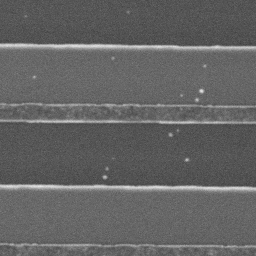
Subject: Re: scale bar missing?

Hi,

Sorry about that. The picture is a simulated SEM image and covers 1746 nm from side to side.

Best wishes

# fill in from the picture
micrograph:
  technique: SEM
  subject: lines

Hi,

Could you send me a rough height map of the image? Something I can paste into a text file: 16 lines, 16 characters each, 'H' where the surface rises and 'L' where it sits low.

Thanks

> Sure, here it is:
LLLLLLLLLLLLLLLL
LLLLLLLLLLLLLLLL
LLLLLLLLLLLLLLLL
HHHHHHHHHHHHHHHH
HHHHHHHHHHHHHHHH
HHHHHHHHHHHHHHHH
HHHHHHHHHHHHHHHH
HHHHHHHHHHHHHHHH
LLLLLLLLLLLLLLLL
LLLLLLLLLLLLLLLL
LLLLLLLLLLLLLLLL
LLLLLLLLLLLLLLLL
HHHHHHHHHHHHHHHH
HHHHHHHHHHHHHHHH
HHHHHHHHHHHHHHHH
HHHHHHHHHHHHHHHH